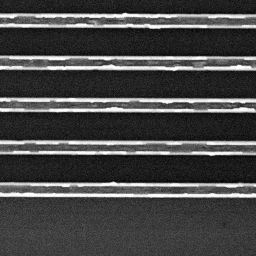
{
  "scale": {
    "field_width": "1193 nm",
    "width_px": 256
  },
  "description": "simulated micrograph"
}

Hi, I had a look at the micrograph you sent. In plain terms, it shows parallel lines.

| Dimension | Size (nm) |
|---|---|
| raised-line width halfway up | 58.2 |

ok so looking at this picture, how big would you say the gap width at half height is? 0.138 um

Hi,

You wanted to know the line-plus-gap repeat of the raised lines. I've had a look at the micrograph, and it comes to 197 nanometers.